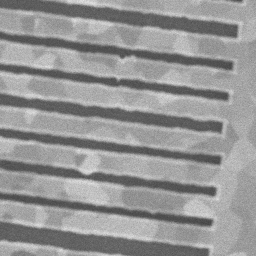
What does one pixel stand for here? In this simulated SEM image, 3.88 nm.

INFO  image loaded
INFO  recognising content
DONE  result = parallel lines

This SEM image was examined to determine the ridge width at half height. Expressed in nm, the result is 77.1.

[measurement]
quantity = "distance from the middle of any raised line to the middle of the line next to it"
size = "123 nm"